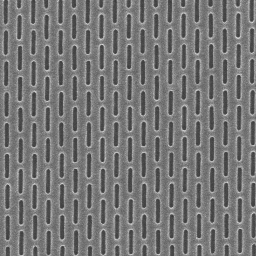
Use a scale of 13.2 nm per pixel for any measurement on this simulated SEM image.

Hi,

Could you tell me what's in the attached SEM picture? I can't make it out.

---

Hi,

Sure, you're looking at a regular array of holes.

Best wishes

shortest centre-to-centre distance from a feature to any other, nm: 267